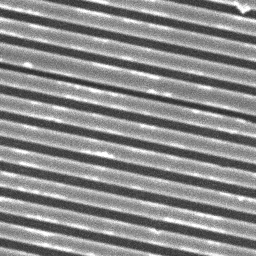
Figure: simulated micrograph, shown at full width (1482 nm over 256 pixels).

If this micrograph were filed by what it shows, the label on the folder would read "parallel lines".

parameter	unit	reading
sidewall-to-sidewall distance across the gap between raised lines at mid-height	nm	62.3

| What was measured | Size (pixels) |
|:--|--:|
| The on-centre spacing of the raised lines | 25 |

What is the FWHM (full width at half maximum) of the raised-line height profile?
0.0828 um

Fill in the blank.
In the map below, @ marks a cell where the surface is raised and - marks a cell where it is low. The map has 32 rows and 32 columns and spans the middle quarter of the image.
@@@@@@@@@@@@------------@@@@@@@@
@@@@@@@@@@@@@@@@-------------@@@
@@@@@@@@@@@@@@@@@@@@@-----------
----@@@@@@@@@@@@@@@@@@@@@@------
--------@@@@@@@@@@@@@@@@@@@@@@--
@@@@---------@@@@@@@@@@@@@@@@@@@
@@@@@@@@@---------@@@@@@@@@@@@@@
@@@@@@@@@@@@@----------@@@@@@@@@
-@@@@@@@@@@@@@@@@@---------@@@@@
------@@@@@@@@@@@@@@@@@---------
-----------@@@@@@@@@@@@@@@@@----
@@--------------@@@@@@@@@@@@@@@@
@@@@@@@-------------@@@@@@@@@@@@
@@@@@@@@@@@@-------------@@@@@@@
@@@@@@@@@@@@@@@@--------------@@
----@@@@@@@@@@@@@@@@@-----------
---------@@@@@@@@@@@@@@@@@------
--------------@@@@@@@@@@@@@@@@@-
@@@@@-------------@@@@@@@@@@@@@@
@@@@@@@@@@-------------@@@@@@@@@
@@@@@@@@@@@@@@--------------@@@@
--@@@@@@@@@@@@@@@@@-------------
-------@@@@@@@@@@@@@@@@@--------
------------@@@@@@@@@@@@@@@@@---
@@@-------------@@@@@@@@@@@@@@@@
@@@@@@@@-------------@@@@@@@@@@@
@@@@@@@@@@@@--------------@@@@@@
@@@@@@@@@@@@@@@@@--------------@
-----@@@@@@@@@@@@@@@@@----------
----------@@@@@@@@@@@@@@@@@-----
@--------------@@@@@@@@@@@@@@@@@
@@@@@@-------------@@@@@@@@@@@@@